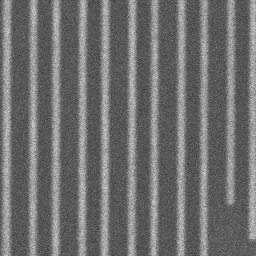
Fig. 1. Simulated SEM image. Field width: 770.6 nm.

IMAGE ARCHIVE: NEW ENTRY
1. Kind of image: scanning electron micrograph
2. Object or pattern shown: parallel lines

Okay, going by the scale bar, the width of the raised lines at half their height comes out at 16.2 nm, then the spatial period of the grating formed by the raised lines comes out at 74.9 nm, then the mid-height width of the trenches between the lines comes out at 0.0573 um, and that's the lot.